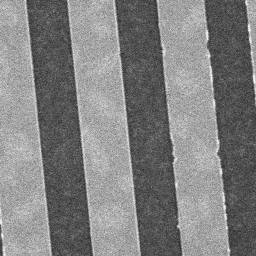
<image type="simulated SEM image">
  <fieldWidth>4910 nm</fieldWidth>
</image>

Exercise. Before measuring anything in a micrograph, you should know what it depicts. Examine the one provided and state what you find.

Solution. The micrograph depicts one or a few lines or trenches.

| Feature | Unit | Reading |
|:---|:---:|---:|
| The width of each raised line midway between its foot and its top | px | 45.9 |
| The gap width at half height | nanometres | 814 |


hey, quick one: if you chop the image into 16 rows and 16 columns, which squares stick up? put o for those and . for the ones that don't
oo..ooo...ooo..o
oo..ooo...ooo...
oo..ooo...ooo...
oo...oo...ooo...
oo...ooo..ooo...
oo...ooo..ooo...
oo...ooo..ooo...
oo...ooo...oo...
oo...ooo...ooo..
ooo..ooo...ooo..
ooo..ooo...ooo..
ooo..ooo...ooo..
ooo...oo...ooo..
ooo...oo...ooo..
ooo...ooo..ooo..
ooo...ooo..ooo..